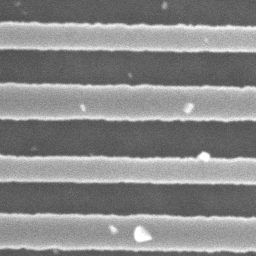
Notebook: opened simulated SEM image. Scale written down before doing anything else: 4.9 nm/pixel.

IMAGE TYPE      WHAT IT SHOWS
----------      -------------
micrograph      lines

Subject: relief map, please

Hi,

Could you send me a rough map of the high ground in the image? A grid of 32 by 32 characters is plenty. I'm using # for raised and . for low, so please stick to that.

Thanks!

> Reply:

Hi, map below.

................................
................................
................................
################################
################################
################################
................................
................................
................................
................................
##..............................
################################
################################
################################
################################
................................
................................
................................
................................
##.......................#......
################################
################################
################################
................................
................................
................................
................................
################################
################################
################################
################################
..........................#..##.